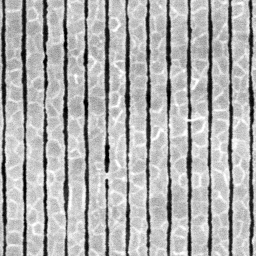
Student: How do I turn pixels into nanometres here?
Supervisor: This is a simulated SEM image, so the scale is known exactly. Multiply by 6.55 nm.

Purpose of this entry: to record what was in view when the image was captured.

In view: parallel lines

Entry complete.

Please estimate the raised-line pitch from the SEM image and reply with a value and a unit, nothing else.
135 nm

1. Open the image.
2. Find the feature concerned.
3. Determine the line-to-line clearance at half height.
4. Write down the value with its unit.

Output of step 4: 27.8 nm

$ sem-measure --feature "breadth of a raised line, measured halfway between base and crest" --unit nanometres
105